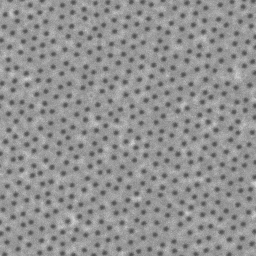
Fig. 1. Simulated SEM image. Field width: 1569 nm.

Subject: a regular array of holes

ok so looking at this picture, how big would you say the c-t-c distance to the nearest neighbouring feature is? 63.4 nanometers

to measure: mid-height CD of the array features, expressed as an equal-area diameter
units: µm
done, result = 0.0324